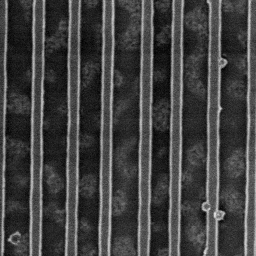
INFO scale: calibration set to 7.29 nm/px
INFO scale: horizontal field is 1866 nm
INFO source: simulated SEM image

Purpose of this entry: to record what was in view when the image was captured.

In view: parallel lines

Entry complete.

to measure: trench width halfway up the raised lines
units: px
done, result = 27.6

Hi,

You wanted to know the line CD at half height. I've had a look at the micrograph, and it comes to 0.071 µm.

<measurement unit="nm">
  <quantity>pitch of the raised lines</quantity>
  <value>257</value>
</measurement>